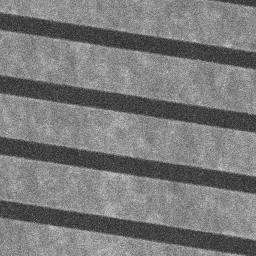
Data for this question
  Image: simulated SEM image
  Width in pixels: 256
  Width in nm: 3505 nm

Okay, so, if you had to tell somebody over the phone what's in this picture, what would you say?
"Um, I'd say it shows parallel lines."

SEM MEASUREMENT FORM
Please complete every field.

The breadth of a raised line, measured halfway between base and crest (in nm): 566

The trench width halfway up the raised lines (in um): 0.259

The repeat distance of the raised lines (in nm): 838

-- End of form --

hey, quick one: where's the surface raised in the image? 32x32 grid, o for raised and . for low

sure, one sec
ooooooooooooooooooooooooooooo...
o.oooooooooooooooooooooooooooooo
.......ooooooooooooooooooooooooo
.............ooooooooooooooooooo
oooo...............ooooooooooooo
ooooooooooo...............oooooo
ooooooooooooooooo...............
oooooooooooooooooooooooo........
oooooooooooooooooooooooooooooo..
..oooooooooooooooooooooooooooooo
........oooooooooooooooooooooooo
..............oooooooooooooooooo
ooooo................ooooooooooo
ooooooooooo................ooooo
oooooooooooooooooo..............
oooooooooooooooooooooooo........
ooooooooooooooooooooooooooooooo.
...ooooooooooooooooooooooooooooo
.........ooooooooooooooooooooooo
o...............oooooooooooooooo
ooooooo................ooooooooo
ooooooooooooo................ooo
oooooooooooooooooooo............
oooooooooooooooooooooooooo......
oooooooooooooooooooooooooooooooo
....oooooooooooooooooooooooooooo
..........oooooooooooooooooooooo
o................ooooooooooooooo
oooooooo...............ooooooooo
oooooooooooooo................oo
ooooooooooooooooooooo...........
ooooooooooooooooooooooooooo.....